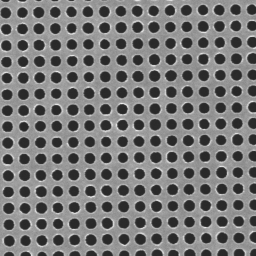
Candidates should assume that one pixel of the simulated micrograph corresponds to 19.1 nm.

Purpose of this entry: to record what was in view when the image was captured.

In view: a regular array of holes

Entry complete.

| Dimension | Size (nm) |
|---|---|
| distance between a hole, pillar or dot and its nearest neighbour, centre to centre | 308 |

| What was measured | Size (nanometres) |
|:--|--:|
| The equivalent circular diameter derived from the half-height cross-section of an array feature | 207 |